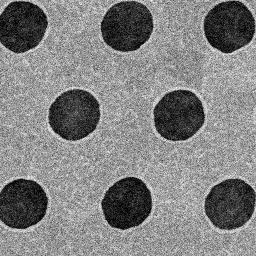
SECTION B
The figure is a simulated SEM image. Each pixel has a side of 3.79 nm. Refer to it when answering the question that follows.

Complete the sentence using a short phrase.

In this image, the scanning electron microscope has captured holes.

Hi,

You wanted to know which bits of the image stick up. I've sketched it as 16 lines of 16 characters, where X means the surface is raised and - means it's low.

---XXXX--XXXX---
---XXX----XXX---
---XXX---XXXX---
XXXXXXXXXXXXXXXX
XXXXXXXXXXXXXXXX
XXXXXXXXXXXXXXXX
XXX---XXXX---XXX
XXX---XXXX---XXX
XXXX--XXXX--XXXX
XXXXXXXXXXXXXXXX
XXXXXXXXXXXXXXXX
--XXXXX--XXXXX--
---XXX----XXX---
---XXX---XXXX---
XXXXXXXXXXXXXXXX
XXXXXXXXXXXXXXXX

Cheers